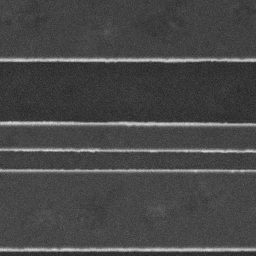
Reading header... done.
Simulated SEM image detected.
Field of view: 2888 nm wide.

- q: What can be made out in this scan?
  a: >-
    lines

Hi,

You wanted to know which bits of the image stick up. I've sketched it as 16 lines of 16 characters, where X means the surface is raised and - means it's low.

XXXXXXXXXXXXXXXX
XXXXXXXXXXXXXXXX
XXXXXXXXXXXXXXXX
XXXXXXXXXXXXXXXX
----------------
----------------
----------------
----------------
XXXXXXXXXXXXXXXX
XXXXXXXXXXXXXXXX
XXXXXXXXXXXXXXXX
XXXXXXXXXXXXXXXX
XXXXXXXXXXXXXXXX
XXXXXXXXXXXXXXXX
XXXXXXXXXXXXXXXX
XXXXXXXXXXXXXXXX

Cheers